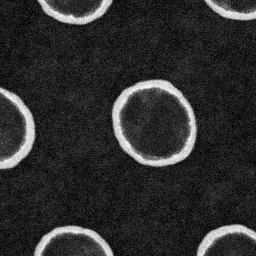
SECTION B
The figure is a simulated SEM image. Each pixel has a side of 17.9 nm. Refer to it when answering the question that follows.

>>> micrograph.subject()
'raised bodies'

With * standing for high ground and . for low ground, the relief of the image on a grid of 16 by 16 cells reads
...***........**
................
................
................
................
........***.....
*......*****....
**.....*****....
**.....*****....
*.......****....
................
................
................
................
...**.........**
..*****......***